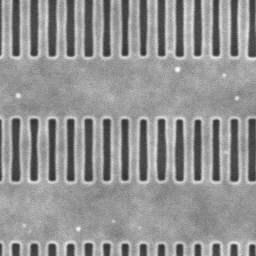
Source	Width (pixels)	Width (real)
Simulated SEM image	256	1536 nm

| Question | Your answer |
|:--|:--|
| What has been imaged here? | groups of lines, slits or small figures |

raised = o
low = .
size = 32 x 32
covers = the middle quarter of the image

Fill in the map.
oooooooooooooooooooooooooooooooo
oooooooooooooooooooooooooooooooo
oooooooooooooooooooooooooooooooo
oooooooooooooooooooooooooooooooo
oooooooooooooooooooooooooooooooo
oooooooooooooooooooooooooooooooo
oooooooooooooooooooooooooooooooo
oooooooooooooooooooooooooooooooo
oooooooooooooooooooooooooooooooo
oooooooooooooooooooooooooooooooo
oooooooooooooooooooooooooooooooo
oooooooooooooooooooooooooooooooo
oooooooooooooooooooooooooooooooo
o.oooo.ooo.ooooooooooooo.ooooooo
...oo..oo...oo..ooo..oo...oo..oo
...oo..oo...oo..ooo..oo...oo..oo
...oo..ooo..oo..ooo..oo...oo..oo
...oo..ooo..oo..ooo..oo...oo..oo
...oo..ooo..oo..ooo..oo...oo..oo
o..oo..ooo..oo..ooo..oo...oo..oo
o..oo..ooo..oo..ooo..oo...oo..oo
o..oo..ooo..oo..ooo..oo...oo..oo
o..oo..ooo..oo...oo..oo...oo..oo
o..oo..ooo..oo..ooo..oo...oo..oo
o..oo..ooo..oo..ooo..oo...oo..oo
...oo..ooo..oo..ooo..oo...oo..oo
...oo..ooo..oo..ooo..oo...oo..oo
...oo..ooo..oo..ooo..oo...oo..oo
...oo..oo...oo..ooo..oo...oo..oo
oooooooooooooooooooooooooooooooo
oooooooooooooooooooooooooooooooo
oooooooooooooooooooooooooooooooo